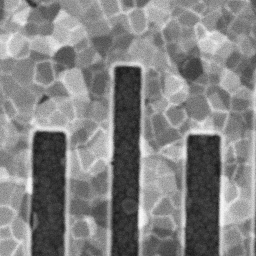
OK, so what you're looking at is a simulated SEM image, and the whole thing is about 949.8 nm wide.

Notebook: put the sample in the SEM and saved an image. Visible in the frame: one or a few lines or trenches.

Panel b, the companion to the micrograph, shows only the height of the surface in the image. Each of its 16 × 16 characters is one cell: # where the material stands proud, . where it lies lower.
################
################
################
################
#######..#######
#######..#######
#######..#######
#######..#######
##..###..###..##
##..###..##...##
##..###..##...##
##..###..##...##
##..###..##...##
##..###..##...##
##..###..##...##
##..###..##...##